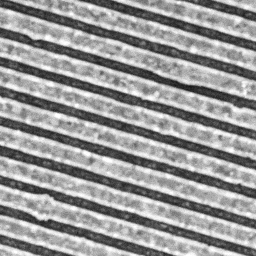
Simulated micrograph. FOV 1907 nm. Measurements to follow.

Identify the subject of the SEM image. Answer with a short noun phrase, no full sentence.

parallel lines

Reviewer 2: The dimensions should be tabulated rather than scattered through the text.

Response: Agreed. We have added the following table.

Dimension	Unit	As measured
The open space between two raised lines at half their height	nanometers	95.7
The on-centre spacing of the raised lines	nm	212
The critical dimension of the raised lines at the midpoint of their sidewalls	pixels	14.9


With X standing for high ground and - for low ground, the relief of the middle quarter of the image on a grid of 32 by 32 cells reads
XXXXXXX------------XXXXXXXXXXXXX
XXXXXXXXXXX-----------XXXXXXXXXX
-XXXXXXXXXXXXX----------XXXXXXXX
----XXXXXXXXXXXXXX---------XXXXX
--------XXXXXXXXXXXXX--------XXX
-----------XXXXXXXXXXXXXX-------
XXX-----------XXXXXXXXXXXXXX----
XXXXXXX----------XXXXXXXXXXXXXXX
XXXXXXXXXX-----------XXXXXXXXXXX
XXXXXXXXXXXXX------------XXXXXXX
---XXXXXXXXXXXXX-------------XXX
------XXXXXXXXXXXXXX------------
----------XXXXXXXXXXXXX---------
XX-----------XXXXXXXXXXXXX------
XXXXX------------XXXXXXXXXXXXX--
XXXXXXXX------------XXXXXXXXXXXX
XXXXXXXXXXXX------------XXXXXXXX
-XXXXXXXXXXXXXX------------XXXXX
-----XXXXXXXXXXXXXX------------X
--------XXXXXXXXXXXXXX----------
------------XXXXXXXXXXXXXX------
XXX------------XXXXXXXXXXXXXX---
XXXXXXX------------XXXXXXXXXXXXX
XXXXXXXXX-------------XXXXXXXXXX
-XXXXXXXXXXXXX-----------XXXXXXX
----XXXXXXXXXXXXX------------XXX
-------XXXXXXXXXXXXXX-----------
----------XXXXXXXXXXXXXX--------
XX------------XXXXXXXXXXXXXX----
XXXXX------------XXXXXXXXXXXXXX-
XXXXXXXXX-----------XXXXXXXXXXXX
XXXXXXXXXXXX------------XXXXXXXX